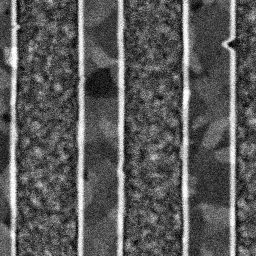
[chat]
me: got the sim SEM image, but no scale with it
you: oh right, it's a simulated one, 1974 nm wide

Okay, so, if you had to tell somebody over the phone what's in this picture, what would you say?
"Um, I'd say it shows one or a few lines or trenches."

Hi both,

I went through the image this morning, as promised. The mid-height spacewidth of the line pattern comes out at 65.3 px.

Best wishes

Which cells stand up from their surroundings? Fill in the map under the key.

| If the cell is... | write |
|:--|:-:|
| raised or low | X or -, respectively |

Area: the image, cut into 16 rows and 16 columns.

X----XXX----XXX-
X----XXX----XXX-
X----XXX----XX--
X----XXX----XXX-
X----XXX----XXX-
X----XXX----XXX-
X----XXX----XXX-
X----XXX----XXX-
X----XXX----XXX-
X----XXX----XXX-
X----XXX----XXX-
X----XXX----XXX-
X----XXX----XXX-
X----XXX----XXX-
X----XXX----XXX-
X----XXX----XXX-